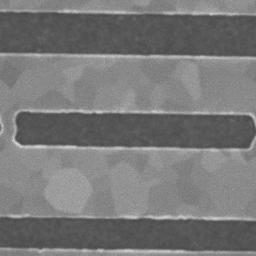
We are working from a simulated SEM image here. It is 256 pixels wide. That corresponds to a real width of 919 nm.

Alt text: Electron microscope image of one or a few lines or trenches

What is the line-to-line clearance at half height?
124 nanometres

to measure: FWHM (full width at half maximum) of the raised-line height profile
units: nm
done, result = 227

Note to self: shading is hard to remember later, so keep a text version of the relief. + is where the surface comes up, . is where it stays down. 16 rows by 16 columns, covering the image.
++++++++++++++++
................
................
++++++++.+++....
++++++++++++++++
++++++++++++++++
++++++++++++++++
+...............
+...............
++++++++++++++++
++++++++++++++++
++++++++++++++++
++++++++++++++++
++++++++++++++++
................
................